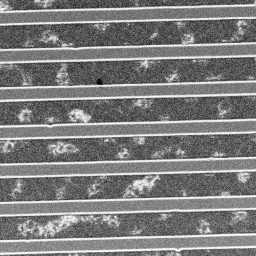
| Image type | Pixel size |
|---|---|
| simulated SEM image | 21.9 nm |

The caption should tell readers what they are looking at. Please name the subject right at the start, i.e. parallel lines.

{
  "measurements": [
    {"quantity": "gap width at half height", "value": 0.556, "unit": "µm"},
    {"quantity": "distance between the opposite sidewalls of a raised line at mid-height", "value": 0.285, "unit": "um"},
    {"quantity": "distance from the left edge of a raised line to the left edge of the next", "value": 38.2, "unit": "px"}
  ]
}